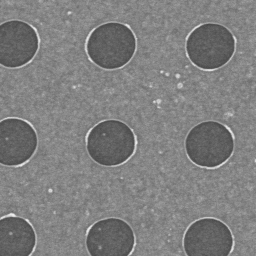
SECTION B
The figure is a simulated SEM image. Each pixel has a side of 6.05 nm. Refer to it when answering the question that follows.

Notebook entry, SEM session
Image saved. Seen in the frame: holes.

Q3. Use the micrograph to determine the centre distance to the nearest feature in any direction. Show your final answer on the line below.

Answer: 591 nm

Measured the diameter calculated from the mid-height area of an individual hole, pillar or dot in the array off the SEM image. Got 0.286 um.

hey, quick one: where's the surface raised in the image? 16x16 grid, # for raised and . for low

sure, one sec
################
..##############
..####..####...#
..####..####..##
################
################
################
.###############
..####..####..##
..####..####..##
################
################
################
################
..####..####..##
..###...####..##